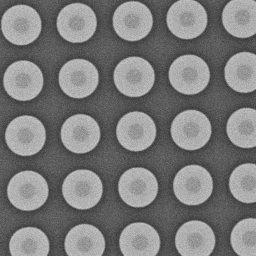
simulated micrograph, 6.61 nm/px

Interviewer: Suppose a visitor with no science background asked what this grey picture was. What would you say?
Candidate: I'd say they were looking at an array of small figures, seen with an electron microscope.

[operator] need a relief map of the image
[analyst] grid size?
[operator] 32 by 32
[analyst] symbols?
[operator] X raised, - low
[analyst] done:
---------X-----XXX----XXX---XXXX
-XXX----XXXX--XXXXX--XXXXX--XXXX
XXXXX--XXXXX--XXXXX--XXXXX--XXXX
XXXXX--XXXXX--XXXXX--XXXXX--XXXX
-XXXX---XXX----XXX----XXX----XX-
--X-----------------------------
--------------------------------
---------XX----XXX----XXX----XXX
-XXXX---XXXX--XXXXX--XXXXX--XXXX
-XXXX--XXXXX--XXXXX--XXXXX--XXXX
XXXXX--XXXXX--XXXXX--XXXXX---XXX
-XXXX---XXXX---XXX-----XX-----X-
---X----------------------------
--------------------------------
---X-----XX-----XXX---XXXX---XXX
-XXXX---XXXX---XXXX---XXXX--XXXX
-XXXXX--XXXX---XXXX--XXXXX--XXXX
-XXXXX--XXXX---XXXX---XXXX---XXX
-XXXX---XXXX----XX-----XX-------
--------------------------------
--------------------------------
---X-----XX-----XXX---XXXX---XXX
-XXXXX--XXXXX--XXXXX--XXXX---XXX
-XXXXX--XXXXX--XXXXX--XXXXX--XXX
-XXXXX--XXXXX--XXXX---XXXX---XXX
--XXX----XXX----XXX----XX-------
--------------------------------
------------------------------XX
---X-----XXX----XXX---XXXX---XXX
--XXXX--XXXXX--XXXXX--XXXXX--XXX
-XXXXX--XXXXX--XXXXX--XXXXX--XXX
-XXXXX--XXXXX--XXXXX--XXXX---XXX